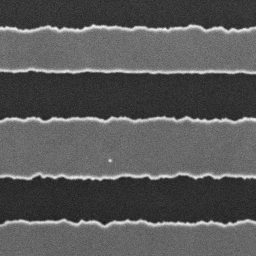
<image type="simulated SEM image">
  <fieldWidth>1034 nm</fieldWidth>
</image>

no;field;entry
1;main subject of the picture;lines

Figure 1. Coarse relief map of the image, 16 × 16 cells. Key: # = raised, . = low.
................
................
################
################
...##.##########
................
................
#############..#
################
################
################
................
................
................
################
################